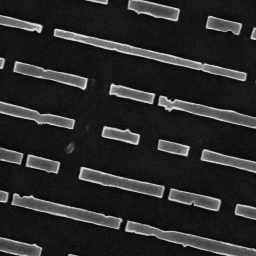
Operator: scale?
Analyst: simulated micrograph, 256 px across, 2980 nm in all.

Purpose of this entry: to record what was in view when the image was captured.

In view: parallel lines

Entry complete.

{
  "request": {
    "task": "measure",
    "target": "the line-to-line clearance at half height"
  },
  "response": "33.7 px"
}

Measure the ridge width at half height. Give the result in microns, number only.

0.115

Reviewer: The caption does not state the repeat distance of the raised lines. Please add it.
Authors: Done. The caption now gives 503 nm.